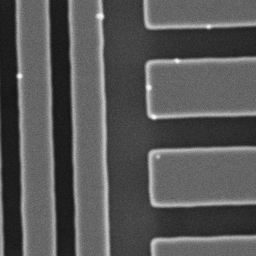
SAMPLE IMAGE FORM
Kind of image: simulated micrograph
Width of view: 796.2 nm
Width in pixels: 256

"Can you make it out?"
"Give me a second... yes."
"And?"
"groups of lines, slits or small figures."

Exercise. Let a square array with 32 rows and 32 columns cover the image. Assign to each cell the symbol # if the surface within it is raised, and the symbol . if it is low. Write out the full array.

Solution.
..####...####.....##############
..####...####.....##############
..####...####.....##############
..####...####......##...........
..####...####...................
..####...####...................
..####...####...................
..####...####........###########
..####...####.....##############
..####...####.....##############
..####...####.....##############
..####...####.....##############
..####...####.....##############
..####...####.....##############
..####...####......######.......
..####...####...................
..####...####...................
...####..####...................
...####..####.............######
...####..####......#############
...####..####......#############
...####..####......#############
...####..####......#############
...####..####......#############
...####..####......#############
...####..####......###########..
...####..####...................
...####..####...................
...####..####...................
...####..#####..................
...####..#####.....#############
...####..#####.....#############